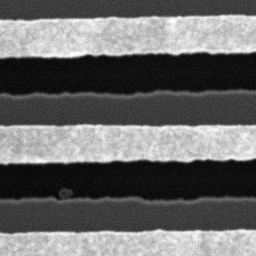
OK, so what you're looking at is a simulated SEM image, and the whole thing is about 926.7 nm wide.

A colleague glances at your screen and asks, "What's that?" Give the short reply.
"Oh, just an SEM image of lines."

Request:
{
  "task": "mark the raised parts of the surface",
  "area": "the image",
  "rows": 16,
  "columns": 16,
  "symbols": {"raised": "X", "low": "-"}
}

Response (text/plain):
XXXXXXXXXXXXXXXX
XXXXXXXXXXXXXXXX
XXXXXXXXXXXXXXXX
XXXXX-----------
----------------
----------------
XXXXXXXXXXXXXXXX
XXXXXXXXXXXXXXXX
XXXXXXXXXXXXXXXX
XXXXXXXXXXXXXXXX
----------------
----------------
XXXXXXXXX---XXXX
XXXXXXXXXXXXXXXX
XXXXXXXXXXXXXXXX
XXXXXXXXXXXXXXXX